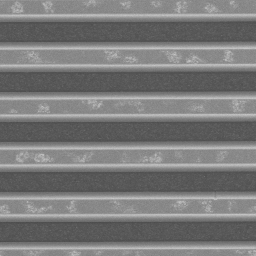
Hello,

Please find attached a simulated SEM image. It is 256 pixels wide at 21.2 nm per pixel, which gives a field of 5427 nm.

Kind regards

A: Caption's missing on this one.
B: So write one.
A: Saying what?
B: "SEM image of parallel lines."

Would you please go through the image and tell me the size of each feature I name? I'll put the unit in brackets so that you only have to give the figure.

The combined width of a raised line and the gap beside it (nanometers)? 1060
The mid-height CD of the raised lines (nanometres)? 517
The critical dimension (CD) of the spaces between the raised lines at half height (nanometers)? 554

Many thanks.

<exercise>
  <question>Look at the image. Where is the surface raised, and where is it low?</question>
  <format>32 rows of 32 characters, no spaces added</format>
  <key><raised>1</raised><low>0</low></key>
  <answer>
11111111111111111111111111111111
11111111111111111111111111111111
00000000000000000000000000000000
00000000000000000000000000000000
00000000000000000000000000000000
00000000000000000000000000000000
11111111111111111111111111111111
11111111111111111111111111111111
11111111111111111111111111111111
00000000000000000000000000000000
00000000000000000000000000000000
00000000000000000000000000000000
11111111111111111111111111111111
11111111111111111111111111111111
11111111111111111111111111111111
00000000000000000000000000000000
00000000000000000000000000000000
00000000000000000000000000000000
11111111111111111111111111111111
11111111111111111111111111111111
11111111111111111111111111111111
00000000000000000000000000000000
00000000000000000000000000000000
00000000000000000000000000000000
11111111111111111111111111111111
11111111111111111111111111111111
11111111111111111111111111111111
00000000000000000000000000000000
00000000000000000000000000000000
00000000000000000000000000000000
00000000000000000000000000000000
11111111111111111111111111111111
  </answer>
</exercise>